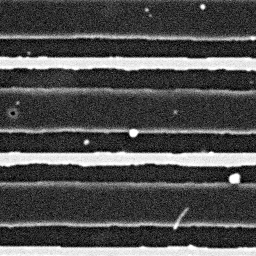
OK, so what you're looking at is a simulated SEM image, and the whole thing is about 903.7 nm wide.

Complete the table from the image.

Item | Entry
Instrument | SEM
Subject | lines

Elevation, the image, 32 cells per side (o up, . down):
oooooooooooooooooooooooooooooooo
oooooooooooooooooooooooooooooooo
oooooooooooooooooooooooooooooooo
oooooooooooooooooooooooooooooooo
oooooooooooooooooooooooooooooooo
................................
................................
oooooooooooooooooooooooooooooooo
oo.ooo..oooo..oooooooooooooooooo
................................
................................
oooooooooooooooooooooooooooooooo
oooooooooooooooooooooooooooooooo
oooooooooooooooooooooooooooooooo
oooooooooooooooooooooooooooooooo
oooooooooooooooooooooooooooooooo
.o.ooo.......o..oooooooooooooooo
................................
................................
oooooooooooooooooooooooooooooooo
oo.......ooooooooo....oooooooooo
................................
.............................o..
oooooooooooooooooooooooooooooooo
oooooooooooooooooooooooooooooooo
oooooooooooooooooooooooooooooooo
oooooooooooooooooooooooooooooooo
oooooooooooooooooooooooooooooooo
................................
................................
................................
oooooooooooooooooooooooooooooooo